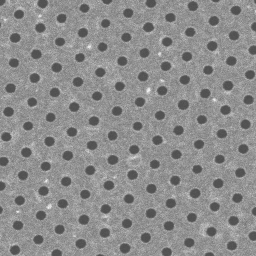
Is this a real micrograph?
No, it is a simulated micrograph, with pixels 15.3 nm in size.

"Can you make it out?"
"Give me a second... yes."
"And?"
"a regular array of holes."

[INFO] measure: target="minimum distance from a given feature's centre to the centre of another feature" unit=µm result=0.364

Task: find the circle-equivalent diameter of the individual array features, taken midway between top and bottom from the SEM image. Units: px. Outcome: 10.3